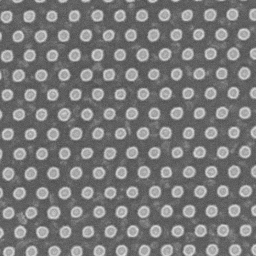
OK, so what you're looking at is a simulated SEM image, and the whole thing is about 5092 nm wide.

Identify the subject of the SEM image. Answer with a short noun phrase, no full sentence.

a regular array of raised bodies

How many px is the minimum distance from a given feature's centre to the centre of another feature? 22.1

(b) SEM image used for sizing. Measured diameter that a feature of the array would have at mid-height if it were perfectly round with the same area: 11 px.